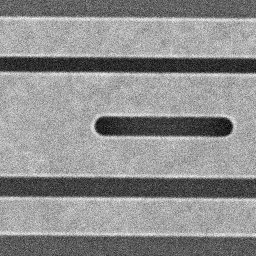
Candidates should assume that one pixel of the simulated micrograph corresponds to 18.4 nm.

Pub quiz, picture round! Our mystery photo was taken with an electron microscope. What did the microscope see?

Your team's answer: groups of lines, slits or small figures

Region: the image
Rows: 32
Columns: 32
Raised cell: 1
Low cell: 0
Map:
00000000000000000000000000000000
00000000000000000000000000000000
11111111111111111111111111111111
11111111111111111111111111111111
11111111111111111111111111111111
11111111111111111111111111111111
11111111111111111111111111111111
00000000000000000000000000000000
00000000000000000000000000000000
11111111111111111111111111111111
11111111111111111111111111111111
11111111111111111111111111111111
11111111111111111111111111111111
11111111111111111111111111111111
11111111111110000000000000001111
11111111111100000000000000000111
11111111111100000000000000000111
11111111111111111111111111111111
11111111111111111111111111111111
11111111111111111111111111111111
11111111111111111111111111111111
11111111111111111111111111111111
00000000000000000000000000000000
00000000000000000000000000000000
00000000000000000000000000000000
11111111111111111111111111111111
11111111111111111111111111111111
11111111111111111111111111111111
11111111111111111111111111111111
00000000000000000000000000000000
00000000000000000000000000000000
00000000000000000000000000000000